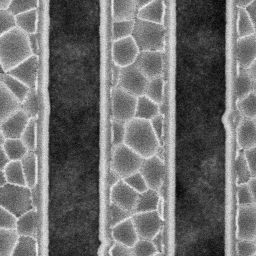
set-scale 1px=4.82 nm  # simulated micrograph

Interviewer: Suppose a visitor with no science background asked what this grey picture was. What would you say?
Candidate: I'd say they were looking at one or a few lines or trenches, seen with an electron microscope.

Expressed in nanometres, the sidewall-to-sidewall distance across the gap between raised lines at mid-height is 269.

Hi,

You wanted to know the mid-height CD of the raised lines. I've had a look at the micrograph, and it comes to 339 nm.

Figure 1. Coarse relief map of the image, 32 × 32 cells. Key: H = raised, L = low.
HHHHHHLLLLLLLHHHHHHHHHLLLLLLLHHH
HHHHHHLLLLLLLHHHHHHHHHLLLLLLLHHH
HHHHHHLLLLLLLHHHHHHHHHLLLLLLLHHH
HHHHHHLLLLLLLHHHHHHHHHLLLLLLLHHH
HHHHHHLLLLLLLHHHHHHHHHLLLLLLLHHH
HHHHHHLLLLLLLHHHHHHHHHLLLLLLLHHH
HHHHHHLLLLLLLHHHHHHHHHLLLLLLLHHH
HHHHHHLLLLLLLHHHHHHHHHLLLLLLLHHH
HHHHHHLLLLLLLHHHHHHHHHLLLLLLLHHH
HHHHHHLLLLLLLHHHHHHHHHLLLLLLLHHH
HHHHHHLLLLLLLHHHHHHHHHLLLLLLLHHH
HHHHHHLLLLLLLHHHHHHHHHLLLLLLLHHH
HHHHHHLLLLLLLHHHHHHHHHLLLLLLLHHH
HHHHHHLLLLLLLHHHHHHHHHLLLLLLLHHH
HHHHHHLLLLLLLHHHHHHHHHLLLLLLHHHH
HHHHHHLLLLLLLHHHHHHHHLLLLLLLHHHH
HHHHHHLLLLLLLHHHHHHHHLLLLLLLLHHH
HHHHHHLLLLLLLHHHHHHHHLLLLLLLLHHH
HHHHHHLLLLLLLHHHHHHHHLLLLLLLHHHH
HHHHHHLLLLLLLHHHHHHHHLLLLLLLHHHH
HHHHHHLLLLLLLHHHHHHHHLLLLLLLLHHH
HHHHHHLLLLLLLHHHHHHHHLLLLLLLHHHH
HHHHHHLLLLLLLHHHHHHHHHLLLLLLHHHH
HHHHHHLLLLLLLHHHHHHHHLLLLLLLLHHH
HHHHHHLLLLLLLHHHHHHHHLLLLLLLLHHH
HHHHHHLLLLLLLHHHHHHHHLLLLLLLLHHH
HHHHHHLLLLLLLHHHHHHHHLLLLLLLLHHH
HHHHHHLLLLLLLHHHHHHHHLLLLLLLLHHH
HHHHHHLLLLLLLHHHHHHHHLLLLLLLHHHH
HHHHHHLLLLLLLHHHHHHHHLLLLLLLHHHH
HHHHHHLLLLLLLHHHHHHHHLLLLLLLLHHH
HHHHHHLLLLLLLHHHHHHHHLLLLLLLHHHH